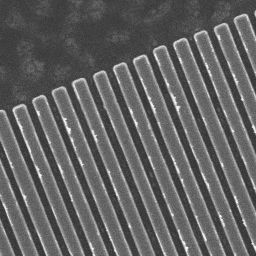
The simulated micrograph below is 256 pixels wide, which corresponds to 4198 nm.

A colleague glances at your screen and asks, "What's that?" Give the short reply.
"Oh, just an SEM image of parallel lines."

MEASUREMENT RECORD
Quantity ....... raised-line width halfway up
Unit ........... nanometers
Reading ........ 221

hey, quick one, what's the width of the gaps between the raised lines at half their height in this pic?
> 0.131 µm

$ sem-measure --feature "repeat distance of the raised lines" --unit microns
0.354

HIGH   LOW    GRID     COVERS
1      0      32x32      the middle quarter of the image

00000000000001110011110011100111
00000000000011110011110011110011
00000000111001110011110011110011
00000000111001111001111001110001
00111000111000111001111001111001
00111100111100111100111100111001
00011100011100111100111100111100
10011110011100011100011100111100
10011110011110011110011110011100
11001110001110011110011110011110
11001111001111001111001110001110
11000111000111001111001111001111
11100111100111000111000111001111
11100011100111100111100111100111
11110011100011100111100111100111
11110011110011110011110011110011
01111001110001110011110011110011
01111001111001110001110011110011
00111001111001111001111001111001
00111100111000111000111001111001
00111100111100111100111100111000
10011110011100011100111100111100
10011110011110011100011100111100
10001110011110011110011110011110
11001111001110001110011110011110
11001111001111001111001111001110
11100111000111000111001111001111
11100111100111100111000111000111
11100011100111100111100111100111
11110011110011110011100011100111
01110011110011110011110011110011
01111001111001110001110011110011